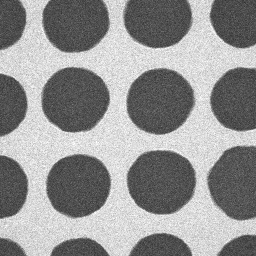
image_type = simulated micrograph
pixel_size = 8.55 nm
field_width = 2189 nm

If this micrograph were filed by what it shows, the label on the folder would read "holes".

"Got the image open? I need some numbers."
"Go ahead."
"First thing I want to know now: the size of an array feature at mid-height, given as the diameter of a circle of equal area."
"571 nanometres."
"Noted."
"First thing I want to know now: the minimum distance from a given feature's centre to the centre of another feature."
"700 nm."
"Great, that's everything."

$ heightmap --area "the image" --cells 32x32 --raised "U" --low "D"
DDDUUUDDDDDDDUUUDDDDDDDDUUUDDDDD
DDDUUDDDDDDDDDUUDDDDDDDDUUDDDDDD
DDDUUDDDDDDDDDUDDDDDDDDDUUDDDDDD
DDDUUUDDDDDDDDUUDDDDDDDDUUUDDDDD
DDDUUUDDDDDDDUUUDDDDDDDUUUUDDDDD
DDUUUUUDDDDDUUUUUUDDDDUUUUUUDDDD
UUUUUUUUDDUUUUUUUUUUUUUUUUUUUUUU
UUUUUUUUUUUUUUUUUUUUUUUUUUUUUUUU
UUUUUUUUDDUUUUUUUUUUUUUUUUUUUUDU
DUUUUUDDDDDDUUUUUDDDDDDUUUUUDDDD
DDDUUUDDDDDDDUUUUDDDDDDDUUUDDDDD
DDDUUDDDDDDDDDUUDDDDDDDDUUDDDDDD
DDDUUDDDDDDDDDUUDDDDDDDDUUDDDDDD
DDDUUDDDDDDDDUUUDDDDDDDDUUDDDDDD
DDDUUUDDDDDDDUUUDDDDDDDDUUUDDDDD
DDDUUUUDDDDDUUUUUDDDDDDUUUUUDDDD
DDUUUUUUDDDUUUUUUUDDDUUUUUUUUUUU
UUUUUUUUUUUUUUUUUUUUUUUUUUUUUUUU
UUUUUUUUUUUUUUUUUUUUUUUUUUUUUDDD
UUUUUUUUUDDUUUUUUDDDDDDUUUUUDDDD
DDUUUUUDDDDDDUUUUDDDDDDDUUUDDDDD
DDDUUUDDDDDDDDUUDDDDDDDDUUDDDDDD
DDDUUUDDDDDDDDUUDDDDDDDDDUDDDDDD
DDDDUUDDDDDDDDUUDDDDDDDDUUDDDDDD
DDDUUUDDDDDDDDUUDDDDDDDDUUDDDDDD
DDDUUUDDDDDDDUUUUDDDDDDUUUUDDDDD
DDUUUUUDDDDDUUUUUUUDDDUUUUUUDDDD
UUUUUUUUUUUUUUUUUUUUUUUUUUUUUUDU
UUUUUUUUUUUUUUUUUUUUUUUUUUUUUUUU
UUUUUUUUUUUUUUUUUUDDDDUUUUUUUUDD
DDUUUUUDDDDDUUUUUDDDDDDUUUUUDDDD
DDDUUUUDDDDDDUUUDDDDDDDDUUUDDDDD